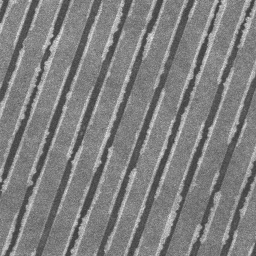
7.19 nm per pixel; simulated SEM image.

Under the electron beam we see parallel lines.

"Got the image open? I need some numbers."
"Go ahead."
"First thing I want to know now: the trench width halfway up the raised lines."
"44.8 nm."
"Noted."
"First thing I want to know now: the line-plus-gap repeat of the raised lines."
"209 nm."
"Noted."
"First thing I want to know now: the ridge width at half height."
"22.4 pixels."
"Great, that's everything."